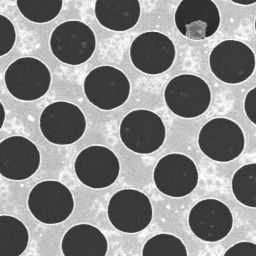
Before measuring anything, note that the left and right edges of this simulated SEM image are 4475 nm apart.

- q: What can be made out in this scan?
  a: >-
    a regular array of holes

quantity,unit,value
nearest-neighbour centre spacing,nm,972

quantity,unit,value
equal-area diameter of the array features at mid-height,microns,0.784